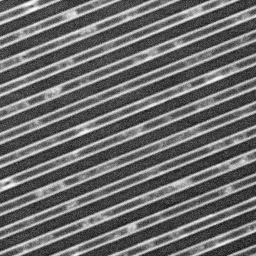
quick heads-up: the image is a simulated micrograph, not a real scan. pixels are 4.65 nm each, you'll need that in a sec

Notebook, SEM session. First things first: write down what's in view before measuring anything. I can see parallel lines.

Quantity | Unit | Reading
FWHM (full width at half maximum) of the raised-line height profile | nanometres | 46.3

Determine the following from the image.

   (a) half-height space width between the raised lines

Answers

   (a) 55.5 nm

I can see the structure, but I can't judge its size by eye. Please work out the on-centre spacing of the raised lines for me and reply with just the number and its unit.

103 nm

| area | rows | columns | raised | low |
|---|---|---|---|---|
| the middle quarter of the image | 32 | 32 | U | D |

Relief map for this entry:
UUUDDDDDDDDUUUUUUDDDDDDDDUUUUUUU
DDDDDDDDUUUUUUUDDDDDDDDUUUUUUDDD
DDDDDDUUUUUUDDDDDDDDUUUUUUUDDDDD
DDDUUUUUUUDDDDDDDDUUUUUUDDDDDDDD
DUUUUUUDDDDDDDDUUUUUUUDDDDDDDDDU
UUUUUDDDDDDDDUUUUUUDDDDDDDDDUUUU
UUDDDDDDDDUUUUUUUDDDDDDDDDUUUUUU
DDDDDDDDUUUUUUUDDDDDDDDUUUUUUUDD
DDDDDDUUUUUUDDDDDDDDDUUUUUUDDDDD
DDDDUUUUUUDDDDDDDDUUUUUUUDDDDDDD
DUUUUUUDDDDDDDDDUUUUUUDDDDDDDDUU
UUUUUDDDDDDDDUUUUUUUDDDDDDDDUUUU
UUDDDDDDDDDUUUUUUDDDDDDDDUUUUUUU
DDDDDDDDUUUUUUUDDDDDDDDUUUUUUDDD
DDDDDDUUUUUUDDDDDDDDUUUUUUUDDDDD
DDDUUUUUUUDDDDDDDDUUUUUUUDDDDDDD
DUUUUUUDDDDDDDDDUUUUUUDDDDDDDDUU
UUUUUDDDDDDDDUUUUUUUDDDDDDDDUUUU
UUDDDDDDDDDUUUUUUDDDDDDDDDUUUUUU
DDDDDDDDUUUUUUUDDDDDDDDUUUUUUDDD
DDDDDDUUUUUUDDDDDDDDDUUUUUUDDDDD
DDDUUUUUUUDDDDDDDDUUUUUUDDDDDDDD
DUUUUUUDDDDDDDDDUUUUUUDDDDDDDDDU
UUUUUDDDDDDDDUUUUUUDDDDDDDDDUUUU
UUDDDDDDDDDUUUUUUDDDDDDDDDUUUUUU
DDDDDDDDUUUUUUDDDDDDDDDUUUUUUUDD
DDDDDDUUUUUUDDDDDDDDDUUUUUUDDDDD
DDDDUUUUUDDDDDDDDDUUUUUUUDDDDDDD
UUUUUUUDDDDDDDDDUUUUUUDDDDDDDDUU
UUUUDDDDDDDDDUUUUUUUDDDDDDDDUUUU
UUDDDDDDDDDUUUUUUDDDDDDDDUUUUUUU
DDDDDDDDUUUUUUUDDDDDDDDUUUUUUDDD